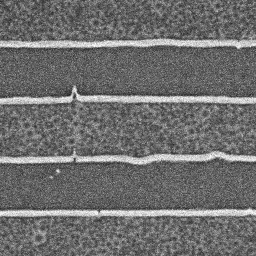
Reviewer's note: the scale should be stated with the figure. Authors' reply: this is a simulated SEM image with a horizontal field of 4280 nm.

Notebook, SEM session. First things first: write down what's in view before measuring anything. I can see one or a few lines or trenches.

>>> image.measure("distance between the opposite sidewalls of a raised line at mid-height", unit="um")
1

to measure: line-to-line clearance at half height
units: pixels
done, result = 54.9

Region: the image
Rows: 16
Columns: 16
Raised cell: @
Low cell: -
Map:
@@@@@@@@@@@@@@@@
@@@@@@@@@@@@@@@@
@@@@@@@@@@@@@@@@
----------------
----------------
----------------
@@@@@@@@@@@@@@@@
@@@@@@@@@@@@@@@@
@@@@@@@@@@@@@@@@
@@@@@@@@@@@@@@@@
----------------
----------------
----------------
@@@@@@@@@@@@@@@@
@@@@@@@@@@@@@@@@
@@@@@@@@@@@@@@@@